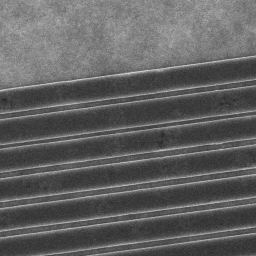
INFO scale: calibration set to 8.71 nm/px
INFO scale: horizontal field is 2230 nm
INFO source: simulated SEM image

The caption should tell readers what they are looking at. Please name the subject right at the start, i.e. parallel lines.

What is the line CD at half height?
0.205 um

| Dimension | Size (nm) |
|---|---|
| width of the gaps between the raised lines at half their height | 48.6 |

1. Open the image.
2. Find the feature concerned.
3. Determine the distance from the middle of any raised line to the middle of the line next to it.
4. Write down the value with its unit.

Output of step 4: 255 nanometers